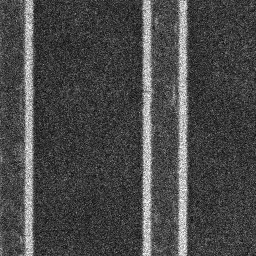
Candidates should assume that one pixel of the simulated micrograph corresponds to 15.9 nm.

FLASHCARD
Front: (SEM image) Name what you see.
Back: one or a few lines or trenches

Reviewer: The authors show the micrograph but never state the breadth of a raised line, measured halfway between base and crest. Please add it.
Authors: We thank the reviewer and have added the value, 0.553 um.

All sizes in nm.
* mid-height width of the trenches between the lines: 1880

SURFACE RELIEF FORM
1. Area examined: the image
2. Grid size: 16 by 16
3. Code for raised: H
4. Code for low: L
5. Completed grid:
HHLLLLLLLHHLLLLL
HHLLLLLLLHHLLLLL
HHLLLLLLLHHLLLLL
HHLLLLLLLHHLLLLL
HHLLLLLLLHHLLLLL
HHLLLLLLLHHLLLLL
HHLLLLLLLHHLLLLL
HHLLLLLLLHHLLLLL
HHLLLLLLLHHLLLLL
HHLLLLLLLHHLLLLL
HHLLLLLLLHHLLLLL
HHLLLLLLLHHLLLLL
HHLLLLLLLHHLLLLL
HHLLLLLLLHHLLLLL
HHLLLLLLLHHLLLLL
HHLLLLLLLHHLLLLL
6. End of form